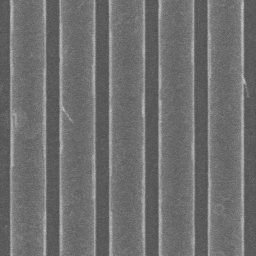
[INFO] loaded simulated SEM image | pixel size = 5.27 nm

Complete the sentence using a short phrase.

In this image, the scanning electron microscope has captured parallel lines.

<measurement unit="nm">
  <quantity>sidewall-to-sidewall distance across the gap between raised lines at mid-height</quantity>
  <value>75.7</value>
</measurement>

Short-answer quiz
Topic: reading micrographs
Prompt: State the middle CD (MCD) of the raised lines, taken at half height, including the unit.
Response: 186 nanometres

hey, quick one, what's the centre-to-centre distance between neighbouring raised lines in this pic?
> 260 nanometres